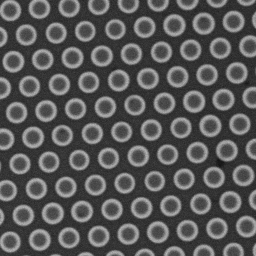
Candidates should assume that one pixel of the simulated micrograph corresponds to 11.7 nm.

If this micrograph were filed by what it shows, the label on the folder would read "an array of small figures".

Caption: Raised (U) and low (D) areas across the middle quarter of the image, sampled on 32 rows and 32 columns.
UUUUDDDDDUDDDDDDDDDDDDDDDDDDDDDD
DDDDDDDDDDDDDDDDDDDDUUDDDDUUUUDD
DDDDDUUUDDDDUUUUDDDUUUUDDDUUUUUD
UDDDUUUUDDDUUUUUDDUUUUUUDDUUUUUD
UDDDUUUUUDDUUUUUDDUUUUUDDDUUUUUD
UDDDUUUUUDDUUUUUDDDUUUUDDDDUUUDD
UDDDUUUUDDDDUUUDDDDDDDDDDDDDDDDD
DDDDDDDDDDDDDDDDDDDDDDDDUUDDDDDU
DDDDDDDDDUUUDDDDUUUDDDDUUUUDDDUU
DUUUUDDDUUUUUDDUUUUUDDDUUUUUDDUU
UUUUUDDDUUUUUDDUUUUUDDDUUUUUDDUU
UUUUUDDDUUUUUDDDUUUUDDDUUUUDDDDU
DUUUUDDDUUUUDDDDUUUDDDDDDDDDDDDD
DDUUDDDDDDDDDDDDDDDDDDDDDDDDDUDD
DDDDDDDDDDDDDDDDDDDDUUUDDDDUUUUD
UDDDDUUUUDDDUUUUDDDUUUUUDDDUUUUU
UUDDDUUUUUDDUUUUUDDUUUUUDDDUUUUU
UUDDDUUUUUDDUUUUUDDUUUUUDDDUUUUD
UUDDDUUUUDDDUUUUDDDDUUUDDDDDDDDD
UUDDDDUUUDDDDDDDDDDDDDDDDDDDDDDD
DDDDDDDDDDDDDDDDDDDDDDDDDUUDDDDU
DDDDDDDDDDUUUDDDDUUUUDDDUUUUDDDU
DDUUUUDDDUUUUDDDUUUUUDDUUUUUDDDU
DUUUUUDDDUUUUUDDUUUUUDDDUUUUDDDU
DUUUUUDDDUUUUDDDUUUUUDDDUUUUDDDD
DDUUUUDDDUUUUDDDDDUDDDDDDDDDDDDD
DDDDDDDDDDDDDDDDDDDDDDDDDDDDDUUD
DDDDDDDDDDDDDDUUDDDDDUUUDDDDUUUU
UDDDDDUUUUDDDUUUUDDDUUUUUDDDUUUU
UUUDDUUUUUDDDUUUUUDDUUUUUDDDUUUU
UUUDDUUUUUDDDUUUUUDDDUUUUDDDUUUU
UUUDDDUUUUDDDUUUUDDDDDUUDDDDDDDD